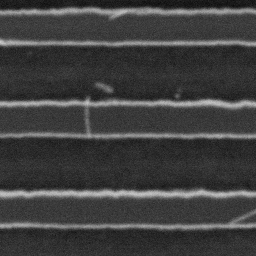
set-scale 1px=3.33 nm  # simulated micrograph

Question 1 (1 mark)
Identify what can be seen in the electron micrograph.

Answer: lines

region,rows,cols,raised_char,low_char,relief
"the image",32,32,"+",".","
................................
++++++++++++++++++++++++++++++++
++++++++++++++++++++++++++++++++
++++++++++++++++++++++++++++++++
++++++++++++++++++++++++++++++++
+.+++++++++++++++++++++++++...++
................................
................................
................................
................................
................................
................................
................................
++++++++++++++++++++++++++++++++
++++++++++++++++++++++++++++++++
++++++++++++++++++++++++++++++++
++++++++++++++++++++++++++++++++
................................
................................
................................
................................
................................
................................
................................
++++++++++++++++++++++++++++++++
++++++++++++++++++++++++++++++++
++++++++++++++++++++++++++++++++
++++++++++++++++++++++++++++++++
.....................+.+........
................................
................................
................................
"